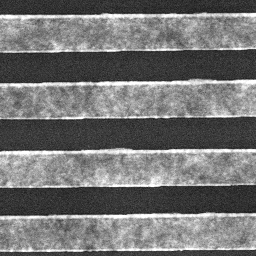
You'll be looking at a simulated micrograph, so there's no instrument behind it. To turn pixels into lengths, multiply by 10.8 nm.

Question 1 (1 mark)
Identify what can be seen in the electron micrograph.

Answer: lines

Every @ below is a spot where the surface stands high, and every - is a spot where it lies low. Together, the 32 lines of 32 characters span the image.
--------------------------------
--------------------------------
@@@@@@@@@@@@@@@@@@@@@@@@@@@@@@@@
@@@@@@@@@@@@@@@@@@@@@@@@@@@@@@@@
@@@@@@@@@@@@@@@@@@@@@@@@@@@@@@@@
@@@@@@@@@@@@@@@@@@@@@@@@@@@@@@@@
--------------------------------
--------------------------------
--------------------------------
--------------------------------
--@@@@@@@@@@@@@@@@@@@@@@@@@@@@@@
@@@@@@@@@@@@@@@@@@@@@@@@@@@@@@@@
@@@@@@@@@@@@@@@@@@@@@@@@@@@@@@@@
@@@@@@@@@@@@@@@@@@@@@@@@@@@@@@@@
@@@@@@@@@@@@@@@@@@@@@@@@@@@@@---
--------------------------------
--------------------------------
--------------------------------
--------------------------------
@@@@@@@@@@@@@@@@@@@@@@@@@@@@@@@@
@@@@@@@@@@@@@@@@@@@@@@@@@@@@@@@@
@@@@@@@@@@@@@@@@@@@@@@@@@@@@@@@@
@@@@@@@@@@@@@@@@@@@@@@@@@@@@@@@@
--------------------------------
--------------------------------
--------------------------------
--------------------------------
@@@@@@@@@@@@@@@@@@@@@@@@@@@@@@@@
@@@@@@@@@@@@@@@@@@@@@@@@@@@@@@@@
@@@@@@@@@@@@@@@@@@@@@@@@@@@@@@@@
@@@@@@@@@@@@@@@@@@@@@@@@@@@@@@@@
--------------------------------